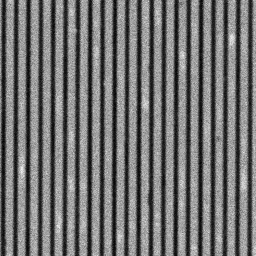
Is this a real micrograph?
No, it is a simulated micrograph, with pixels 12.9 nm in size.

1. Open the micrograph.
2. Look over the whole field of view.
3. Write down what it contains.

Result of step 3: parallel lines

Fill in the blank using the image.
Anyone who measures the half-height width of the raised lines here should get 102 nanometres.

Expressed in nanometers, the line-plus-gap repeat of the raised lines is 159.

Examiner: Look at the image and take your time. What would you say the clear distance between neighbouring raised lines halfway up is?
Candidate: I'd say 51.6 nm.